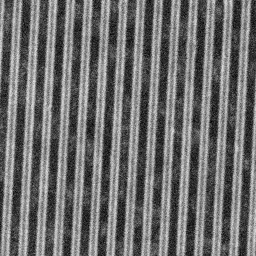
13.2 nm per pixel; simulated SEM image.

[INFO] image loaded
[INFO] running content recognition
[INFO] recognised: parallel lines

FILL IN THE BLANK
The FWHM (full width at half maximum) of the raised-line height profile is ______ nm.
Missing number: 89.2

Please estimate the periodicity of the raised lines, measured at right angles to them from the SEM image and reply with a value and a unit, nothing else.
0.232 um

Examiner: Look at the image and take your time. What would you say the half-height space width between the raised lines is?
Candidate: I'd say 140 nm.